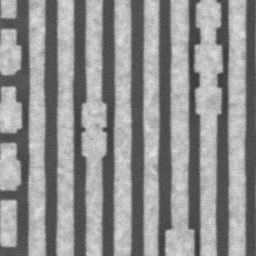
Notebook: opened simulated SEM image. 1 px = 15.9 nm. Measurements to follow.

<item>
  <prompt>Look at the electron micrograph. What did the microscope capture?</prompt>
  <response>wiring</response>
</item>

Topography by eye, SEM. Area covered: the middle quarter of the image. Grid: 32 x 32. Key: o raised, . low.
oo....ooo....oooo...ooo....oooo.
oo....ooo....oooo...ooo....oooo.
oo....ooo....oooo...ooo....oooo.
oo....ooo....oooo...ooo....oooo.
oo....ooo....oooo...ooo....oooo.
oo....ooo....ooo....ooo....oooo.
oo....ooo....ooo....ooo....oooo.
oo....ooo....ooo....ooo....oooo.
oo....ooo....ooo....ooo....oooo.
oo....ooo....ooo....ooo....oooo.
oo...ooooo...ooo....ooo....oooo.
oo...ooooo...oooo...ooo....oooo.
oo...ooooo...oooo...oooo...oooo.
oo...ooooo...oooo...oooo...oooo.
oo...ooooo...oooo...oooo...oooo.
oo...ooooo...oooo...oooo...oooo.
oo....ooo....oooo...oooo...oooo.
oo...ooooo...oooo...ooo....oooo.
oo...ooooo...oooo...ooo....oooo.
oo...ooooo...oooo...ooo....oooo.
oo...ooooo...oooo...ooo....oooo.
oo...ooooo...oooo...ooo....oooo.
oo...ooooo...oooo...ooo....oooo.
oo....ooo....ooo....ooo....oooo.
oo....ooo....ooo....ooo....oooo.
oo....ooo....ooo....ooo....oooo.
oo....ooo....ooo....ooo....oooo.
oo....ooo....oooo...ooo....oooo.
oo....ooo....oooo...ooo....oooo.
oo....ooo....oooo...ooo....oooo.
oo....ooo....oooo...ooo....oooo.
oo....ooo....oooo...ooo....oooo.